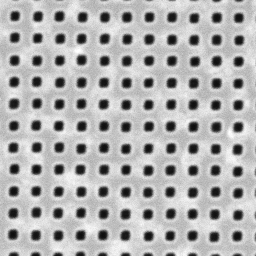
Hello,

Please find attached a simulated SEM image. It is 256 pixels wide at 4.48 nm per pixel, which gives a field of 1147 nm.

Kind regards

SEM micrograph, a regular array of holes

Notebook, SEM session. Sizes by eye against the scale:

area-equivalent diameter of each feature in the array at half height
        0.0484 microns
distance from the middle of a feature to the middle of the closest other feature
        95.8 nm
